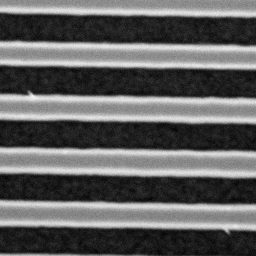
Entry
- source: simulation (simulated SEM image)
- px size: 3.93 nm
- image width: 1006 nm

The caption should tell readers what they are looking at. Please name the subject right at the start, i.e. parallel lines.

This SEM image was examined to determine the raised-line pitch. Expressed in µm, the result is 0.209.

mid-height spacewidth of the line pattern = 120 nm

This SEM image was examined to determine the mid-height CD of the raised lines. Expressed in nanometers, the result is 87.5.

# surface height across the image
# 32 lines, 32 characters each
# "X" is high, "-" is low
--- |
XXXXXXXXXXXXXXXXXXXXXXXXXXXXXXXX
-----XXXXXXXXXXXXXXXXXXXXXXXXXXX
--------------------------------
--------------------------------
--------------------------------
XXXXXXXXXX----------------------
XXXXXXXXXXXXXXXXXXXXXXXXXXXXXXXX
XXXXXXXXXXXXXXXXXXXXXXXXXXXXXXXX
-----------------------------XXX
--------------------------------
--------------------------------
--------------------------------
XXXXXXXXXXXXXXXXXXXXXXXXXXXXXXXX
XXXXXXXXXXXXXXXXXXXXXXXXXXXXXXXX
XXXXXXXXXXXXXXXXXXXXXXXXXXXXXXXX
--------------------------------
--------------------------------
--------------------------------
--------------------------------
XXXXXXXXXXXXXXXXXXXXXXXXXXXXXXXX
XXXXXXXXXXXXXXXXXXXXXXXXXXXXXXXX
------XXXXXXXXXXXXXXXXXXXXXXXXXX
--------------------------------
--------------------------------
--------------------------------
XXXXXXXXXXXXXXX-----------------
XXXXXXXXXXXXXXXXXXXXXXXXXXXXXXXX
XXXXXXXXXXXXXXXXXXXXXXXXXXXXXXXX
-----------------------------XXX
--------------------------------
--------------------------------
--------------------------------